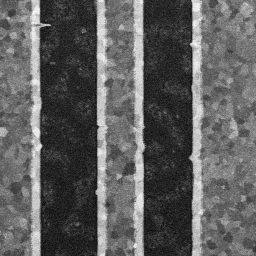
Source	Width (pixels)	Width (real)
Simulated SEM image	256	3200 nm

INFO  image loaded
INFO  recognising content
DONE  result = one or a few lines or trenches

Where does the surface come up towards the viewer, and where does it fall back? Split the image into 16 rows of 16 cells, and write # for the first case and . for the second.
##....###...####
##....###...####
##....###...####
##....###...####
##....###...####
##....###...####
##....###...####
##....###...####
##....###...####
##....###...####
##....###...####
##....###...####
##....###...####
##....###...####
##....###...####
##....###...####